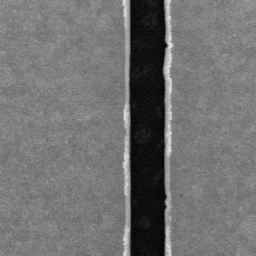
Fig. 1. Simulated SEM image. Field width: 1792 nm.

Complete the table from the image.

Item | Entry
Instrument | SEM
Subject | one or a few lines or trenches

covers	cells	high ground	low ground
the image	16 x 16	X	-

XXXXXXXX--XXXXXX
XXXXXXXX--XXXXXX
XXXXXXXX--XXXXXX
XXXXXXXX--XXXXXX
XXXXXXXX--XXXXXX
XXXXXXXX--XXXXXX
XXXXXXXX--XXXXXX
XXXXXXXX--XXXXXX
XXXXXXXX--XXXXXX
XXXXXXXX--XXXXXX
XXXXXXXX--XXXXXX
XXXXXXXX--XXXXXX
XXXXXXXX--XXXXXX
XXXXXXXX--XXXXXX
XXXXXXXX--XXXXXX
XXXXXXXX--XXXXXX